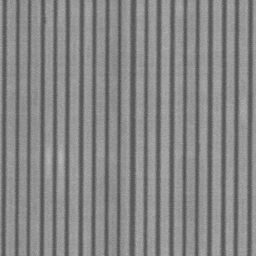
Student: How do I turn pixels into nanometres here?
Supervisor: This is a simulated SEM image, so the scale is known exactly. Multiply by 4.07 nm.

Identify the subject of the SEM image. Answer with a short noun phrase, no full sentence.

parallel lines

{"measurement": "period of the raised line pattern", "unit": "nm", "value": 52.5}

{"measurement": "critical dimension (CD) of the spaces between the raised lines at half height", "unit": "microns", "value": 0.0194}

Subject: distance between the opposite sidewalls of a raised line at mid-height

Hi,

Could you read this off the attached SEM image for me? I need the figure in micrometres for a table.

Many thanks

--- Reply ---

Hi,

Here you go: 0.0346